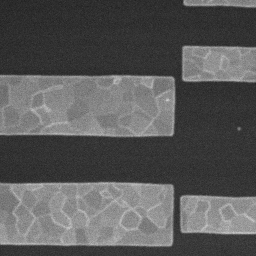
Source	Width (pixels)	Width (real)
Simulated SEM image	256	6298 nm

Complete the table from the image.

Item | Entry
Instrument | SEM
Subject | wiring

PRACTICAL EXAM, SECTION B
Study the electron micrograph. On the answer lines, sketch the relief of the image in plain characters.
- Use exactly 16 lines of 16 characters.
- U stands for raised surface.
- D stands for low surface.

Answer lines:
DDDDDDDDDDDDDDDD
DDDDDDDDDDDDDDDD
DDDDDDDDDDDDDDDD
DDDDDDDDDDDUUUUU
DDDDDDDDDDDUUUUU
UUUUUUUUUUUDDDDD
UUUUUUUUUUUDDDDD
UUUUUUUUUUUDDDDD
DDDDDDDDDDDDDDDD
DDDDDDDDDDDDDDDD
DDDDDDDDDDDDDDDD
UDUUUUUUUDDDDDDD
UUUUUUUUUUUUUUUU
UUUUUUUUUUUUUUUU
UUUUUUUUUUUDDUUU
DDDDDDDDDDDDDDDD